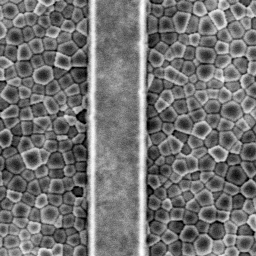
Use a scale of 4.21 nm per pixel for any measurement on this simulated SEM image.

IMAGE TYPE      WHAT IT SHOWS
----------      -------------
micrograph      one or a few lines or trenches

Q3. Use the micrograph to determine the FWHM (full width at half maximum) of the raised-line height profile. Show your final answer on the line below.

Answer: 206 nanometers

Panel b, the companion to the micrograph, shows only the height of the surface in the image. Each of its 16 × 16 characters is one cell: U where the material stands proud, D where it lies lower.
DDDDDDUUUDDDDDDD
DDDDDDUUUDDDDDDD
DDDDDDUUUDDDDDDD
DDDDDDUUUDDDDDDD
DDDDDDUUUDDDDDDD
DDDDDDUUUDDDDDDD
DDDDDDUUUDDDDDDD
DDDDDDUUUDDDDDDD
DDDDDDUUUDDDDDDD
DDDDDDUUUDDDDDDD
DDDDDDUUUDDDDDDD
DDDDDDUUUDDDDDDD
DDDDDDUUUDDDDDDD
DDDDDDUUUDDDDDDD
DDDDDDUUUDDDDDDD
DDDDDDUUUDDDDDDD